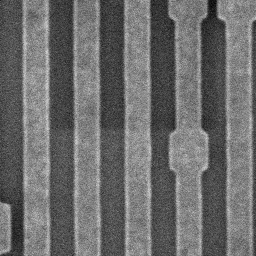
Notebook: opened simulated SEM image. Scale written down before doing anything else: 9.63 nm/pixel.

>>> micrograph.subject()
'wiring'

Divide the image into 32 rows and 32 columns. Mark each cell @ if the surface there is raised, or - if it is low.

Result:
---@@@---@@@----@@@--@@@@@-@@@@@
---@@@---@@@----@@@--@@@@@-@@@@@
---@@@---@@@----@@@---@@@---@@@@
---@@@---@@@----@@@---@@@---@@@-
---@@@---@@@----@@@---@@@---@@@-
---@@@---@@@----@@@---@@@---@@@-
---@@@---@@@----@@@---@@@---@@@-
---@@@---@@@----@@@---@@@---@@@-
---@@@---@@@----@@@---@@@---@@@-
---@@@---@@@----@@@---@@@---@@@-
---@@@---@@@----@@@---@@@---@@@-
---@@@---@@@----@@@---@@@---@@@-
---@@@---@@@----@@@---@@@---@@@-
---@@@---@@@----@@@---@@@---@@@-
---@@@---@@@----@@@---@@@---@@@-
---@@@---@@@----@@@---@@@----@@-
---@@@----@@----@@@---@@@----@@-
---@@@---@@@----@@@--@@@@@--@@@-
---@@@---@@@----@@@--@@@@@--@@@-
---@@@---@@@----@@@--@@@@@---@@-
---@@@---@@@----@@@--@@@@@---@@-
---@@@----@@----@@@---@@@----@@-
---@@@----@@----@@@---@@@----@@-
---@@@---@@@----@@@---@@@---@@@-
---@@@---@@@----@@@---@@@---@@@-
---@@@---@@@----@@@---@@@---@@@-
@--@@@---@@@----@@@---@@@----@@-
@--@@@----@@----@@@---@@@----@@-
@--@@@----@@----@@@---@@@----@@-
@--@@@----@@----@@@---@@@----@@-
@--@@@----@@----@@@---@@@----@@-
@--@@@----@@----@@@---@@@----@@-